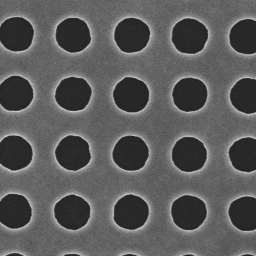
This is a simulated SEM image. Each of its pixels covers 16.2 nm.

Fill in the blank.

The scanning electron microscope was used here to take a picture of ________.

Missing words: a regular array of holes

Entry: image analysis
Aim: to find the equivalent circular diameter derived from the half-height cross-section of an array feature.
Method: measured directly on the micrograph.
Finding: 572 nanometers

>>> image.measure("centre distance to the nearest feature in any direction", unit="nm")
935